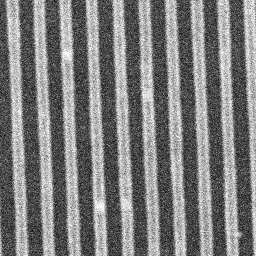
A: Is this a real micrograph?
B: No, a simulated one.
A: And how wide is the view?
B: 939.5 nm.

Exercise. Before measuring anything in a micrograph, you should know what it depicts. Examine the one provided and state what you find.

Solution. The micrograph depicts parallel lines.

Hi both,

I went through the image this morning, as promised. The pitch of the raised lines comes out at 96.5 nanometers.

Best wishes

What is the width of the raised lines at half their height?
34.9 nm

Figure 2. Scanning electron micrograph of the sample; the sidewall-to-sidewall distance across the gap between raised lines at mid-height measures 59.6 nanometers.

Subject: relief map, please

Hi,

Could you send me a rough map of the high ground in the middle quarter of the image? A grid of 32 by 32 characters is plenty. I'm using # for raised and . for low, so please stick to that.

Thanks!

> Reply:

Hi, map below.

##....###....##.....##....##....
##....###....##.....##....##....
##.....##....##.....##....##....
##.....##....##.....##....##....
##.....##....##.....##....###...
##.....##....##.....##....###...
##.....##....##.....##....###...
##.....##....###....##....###...
##.....##....###....##.....##...
##.....##....###....##.....##...
##.....##....###....##.....##...
##.....##....###....##.....##...
##.....##.....##....##.....##...
##.....##.....##....##.....##...
##.....##.....##....##.....##...
##.....##....###....##.....##...
###....##....###....##.....##...
###....##.....##....##.....##...
###....##.....##....###....##...
.##....##.....##....###....##...
.##....##.....##....###....##...
.##....##.....##....###....##...
.##....##.....##....###....##...
.##....##.....##....###....##...
.##....###....##....###....##...
.##....###....##.....##....##...
.##....###....###....##....##...
.##....###....###....##....##...
.##....###....###....##....##...
.##....###....###....##....##...
.##....###....###....##....###..
.##....###....###....##....###..